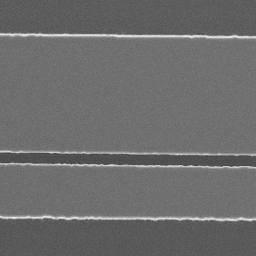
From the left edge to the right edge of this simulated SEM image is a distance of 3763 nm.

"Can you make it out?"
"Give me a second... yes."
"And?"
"lines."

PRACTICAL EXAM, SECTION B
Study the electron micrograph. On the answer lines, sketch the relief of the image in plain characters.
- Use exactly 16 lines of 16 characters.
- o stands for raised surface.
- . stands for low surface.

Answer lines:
................
................
oooooooooooooooo
oooooooooooooooo
oooooooooooooooo
oooooooooooooooo
oooooooooooooooo
oooooooooooooooo
oooooooooooooooo
oooooooooooooooo
oooooooooooooooo
oooooooooooooooo
oooooooooooooooo
oooooooooooooooo
................
................